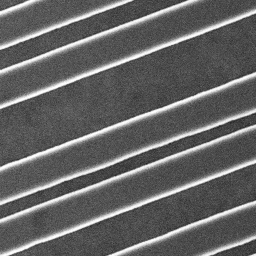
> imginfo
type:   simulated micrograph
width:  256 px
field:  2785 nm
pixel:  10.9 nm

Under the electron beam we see lines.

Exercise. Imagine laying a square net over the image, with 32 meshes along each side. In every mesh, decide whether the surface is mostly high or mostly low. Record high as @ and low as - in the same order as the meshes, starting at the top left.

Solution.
---@@@@@@@@@@@@--------@@@@@@@@@
@@@@@@@@@@@@--------@@@@@@@@@@@@
@@@@@@@@@@-------@@@@@@@@@@@@---
@@@@@@@-------@@@@@@@@@@@@@-----
@@@@--------@@@@@@@@@@@@--------
@@-------@@@@@@@@@@@@@----------
------@@@@@@@@@@@@@-------------
----@@@@@@@@@@@@----------------
-@@@@@@@@@@@@-------------------
@@@@@@@@@@@--------------------@
@@@@@@@@--------------------@@@@
@@@@@@--------------------@@@@@@
@@@--------------------@@@@@@@@@
--------------------@@@@@@@@@@@@
-----------------@@@@@@@@@@@@@--
---------------@@@@@@@@@@@@@----
------------@@@@@@@@@@@@@-----@@
---------@@@@@@@@@@@@@-----@@@@@
-------@@@@@@@@@@@@-----@@@@@@@@
----@@@@@@@@@@@@------@@@@@@@@@@
-@@@@@@@@@@@@@-----@@@@@@@@@@@@-
@@@@@@@@@@@-----@@@@@@@@@@@@@---
@@@@@@@@------@@@@@@@@@@@@------
@@@@@@-----@@@@@@@@@@@@---------
@@@-----@@@@@@@@@@@@@-----------
-----@@@@@@@@@@@@@-------------@
---@@@@@@@@@@@@-------------@@@@
@@@@@@@@@@@@@-------------@@@@@@
@@@@@@@@@@-------------@@@@@@@@@
@@@@@@@-------------@@@@@@@@@@@@
@@@@-------------@@@@@@@@@@@@@--
@@-------------@@@@@@@@@@@@-----